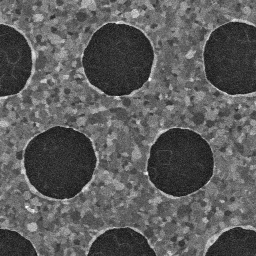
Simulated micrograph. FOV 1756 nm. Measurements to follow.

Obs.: holes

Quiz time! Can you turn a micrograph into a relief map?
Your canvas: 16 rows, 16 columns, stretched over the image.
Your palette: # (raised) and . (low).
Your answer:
################
#######.######..
..####...####...
..###.....###...
..###....####...
.#####...#####..
################
################
##...#####...###
##....###....###
#.....###....###
##...#####...###
################
################
.#####...#####..
..####....###...